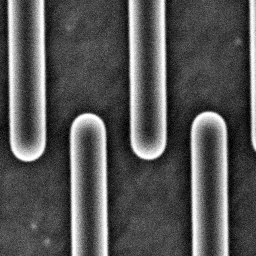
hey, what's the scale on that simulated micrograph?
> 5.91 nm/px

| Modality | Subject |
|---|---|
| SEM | groups of lines, slits or small figures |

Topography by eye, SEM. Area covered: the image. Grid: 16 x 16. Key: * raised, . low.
.**.....**......
.**.....**......
.**.....**......
.**.....**......
.**.....**......
.**.....**......
.**.....**......
.**..*..**..**..
.**.***.**..**..
.**.***..*..**..
....***.....**..
.....**.....**..
.....**.....**..
.....**.....**..
.....**.....**..
.....**.....**..